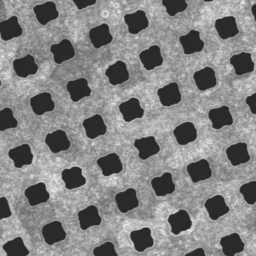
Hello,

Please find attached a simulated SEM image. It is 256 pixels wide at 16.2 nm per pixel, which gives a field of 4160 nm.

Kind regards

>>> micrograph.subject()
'a regular array of holes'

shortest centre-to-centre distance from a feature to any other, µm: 0.636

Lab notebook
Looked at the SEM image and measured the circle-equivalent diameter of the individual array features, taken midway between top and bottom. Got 374 nanometers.